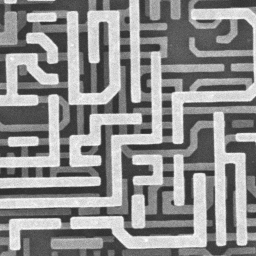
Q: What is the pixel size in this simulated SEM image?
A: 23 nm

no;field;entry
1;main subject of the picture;wiring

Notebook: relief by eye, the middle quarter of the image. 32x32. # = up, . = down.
.###.......###...##...##........
.###.......###...##...##........
.###.......###...##...##........
.###.......###...##...##........
.###.......###...##...##........
.###.......###...##...##........
.###......####...##...##........
.############....##...##...#####
.###########.....##...##...#####
.##########...........##...###..
......................##...##...
......................##...##...
......................##...##...
.......############...##...##...
.......############...##...###..
.......##.............##...###..
.......##.............##...###..
......###............###...###..
.########...############...###..
.########...############...###..
.####.......##..................
.###........##..................
.###........##..................
.########...##...#######...###..
.########...##...########..###..
..##........##........###...##..
............##........###...##..
............##........###...##..
#########...##...########..###..
#########...##...########..###..
######......##.............###..
............##.............###..